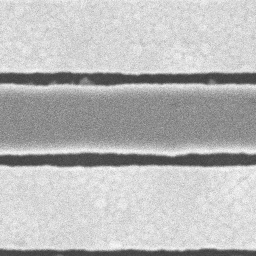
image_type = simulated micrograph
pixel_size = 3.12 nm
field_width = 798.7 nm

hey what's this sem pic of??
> lines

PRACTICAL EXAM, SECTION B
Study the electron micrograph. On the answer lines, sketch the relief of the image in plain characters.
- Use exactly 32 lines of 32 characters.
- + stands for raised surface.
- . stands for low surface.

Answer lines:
++++++++++++++++++++++++++++++++
++++++++++++++++++++++++++++++++
++++++++++++++++++++++++++++++++
++++++++++++++++++++++++++++++++
++++++++++++++++++++++++++++++++
++++++++++++++++++++++++++++++++
++++++++++++++++++++++++++++++++
++++++++++++++++++++++++++++++++
++++++++++++++++++++++++++++++++
................................
................................
++++++++++++++++++++++++++++++++
++++++++++++++++++++++++++++++++
++++++++++++++++++++++++++++++++
++++++++++++++++++++++++++++++++
++++++++++++++++++++++++++++++++
++++++++++++++++++++++++++++++++
++++++++++++++++++++++++++++++++
++++++++++++++++++++++++++++++++
....................++..........
................................
++++++++++++++++++++++++++++++++
++++++++++++++++++++++++++++++++
++++++++++++++++++++++++++++++++
++++++++++++++++++++++++++++++++
++++++++++++++++++++++++++++++++
++++++++++++++++++++++++++++++++
++++++++++++++++++++++++++++++++
++++++++++++++++++++++++++++++++
++++++++++++++++++++++++++++++++
++++++++++++++++++++++++++++++++
................................